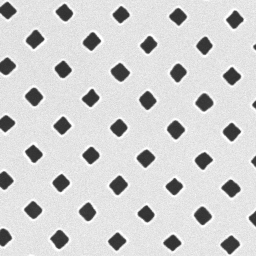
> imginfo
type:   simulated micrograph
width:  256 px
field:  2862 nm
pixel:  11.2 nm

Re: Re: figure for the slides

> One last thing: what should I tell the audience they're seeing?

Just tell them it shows a regular array of holes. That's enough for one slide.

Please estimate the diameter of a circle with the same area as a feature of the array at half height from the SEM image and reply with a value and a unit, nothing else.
186 nanometers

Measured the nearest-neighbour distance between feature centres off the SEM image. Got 438 nm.